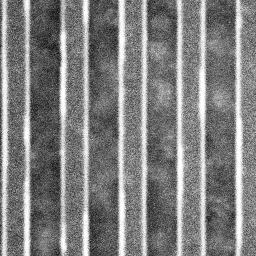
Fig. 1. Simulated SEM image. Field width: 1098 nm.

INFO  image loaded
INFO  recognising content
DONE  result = parallel lines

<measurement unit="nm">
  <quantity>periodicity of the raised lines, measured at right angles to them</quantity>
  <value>250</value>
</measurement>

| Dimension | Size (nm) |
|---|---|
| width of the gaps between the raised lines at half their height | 144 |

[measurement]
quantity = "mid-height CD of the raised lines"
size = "106 nm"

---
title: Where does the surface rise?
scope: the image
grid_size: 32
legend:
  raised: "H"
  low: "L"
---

LHHHLLLLHHHLLLLHHHLLLLHHHLLLLLHH
LHHHLLLLHHHLLLLHHHLLLLHHHLLLLLHH
LHHHLLLLHHHLLLLHHHLLLLHHHLLLLLHH
LHHHLLLLHHHLLLLHHHLLLLHHHLLLLLHH
HHHHLLLLHHHLLLLHHHLLLLHHHLLLLLHH
HHHHLLLLHHHLLLLHHHLLLLHHHLLLLLHH
LHHLLLLLHHHLLLLHHHLLLLHHHLLLLLHH
LHHHLLLLHHHLLLLHHHLLLLHHHLLLLLHH
LHHHLLLLHHHLLLLHHHLLLLHHHLLLLLHH
LHHHLLLLHHHLLLLHHHLLLLHHHLLLLLHH
HHHHLLLLHHHLLLLHHHLLLLHHHLLLLLHH
LHHHLLLLHHHLLLLHHHLLLLHHHLLLLLHH
LHHHLLLLHHHLLLLHHHLLLLHHHLLLLLHH
LHHHLLLLHHHLLLLHHHLLLLHHHLLLLLHH
LHHHLLLLHHHLLLLHHHLLLLHHHLLLLLHH
LHHHLLLLHHHLLLLHHHLLLLHHHLLLLLHH
LHHHLLLLHHHLLLLHHHLLLLHHHLLLLLHH
LHHHLLLLHHHLLLLHHHLLLLHHHLLLLLHH
LHHHLLLLHHHLLLLHHHLLLLHHHLLLLLHH
LHHHLLLLHHHLLLLHHHLLLLHHHLLLLLHH
HHHHLLLLHHHLLLLHHHLLLLHHHLLLLLHH
LHHHLLLLHHHLLLLHHHLLLLHHHLLLLLHH
LHHHLLLLHHHLLLLHHHLLLLHHHLLLLLHH
LHHHLLLLHHHLLLLHHHLLLLHHHLLLLLHH
LHHHLLLLHHHLLLLHHHLLLLHHHLLLLLHH
LHHHLLLLHHHLLLLHHHLLLLHHHLLLLLHH
LHHHLLLLHHHLLLLHHHLLLLHHHLLLLLHH
LHHHLLLLHHHLLLLHHHLLLLHHHLLLLLHH
LHHHLLLLHHHLLLLHHHLLLLHHHLLLLLHH
LHHHLLLLHHHLLLLHHHLLLLHHHLLLLLHH
LHHHLLLLHHHLLLLHHHLLLLHHHLLLLLHH
LHHHLLLLHHHLLLLHHHLLLLHHHLLLLLHH